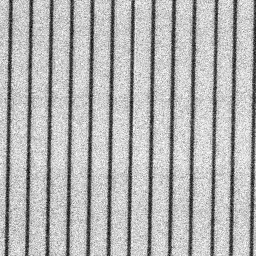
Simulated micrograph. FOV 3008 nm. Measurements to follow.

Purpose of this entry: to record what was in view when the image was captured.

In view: parallel lines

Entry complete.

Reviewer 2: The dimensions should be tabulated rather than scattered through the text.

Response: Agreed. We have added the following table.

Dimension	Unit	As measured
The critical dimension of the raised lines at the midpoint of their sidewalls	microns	0.0675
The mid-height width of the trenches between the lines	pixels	14.6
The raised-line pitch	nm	240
